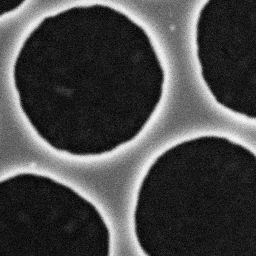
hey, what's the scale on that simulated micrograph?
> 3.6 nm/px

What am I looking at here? holes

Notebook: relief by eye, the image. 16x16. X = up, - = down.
-XXX---XXXXXX---
XX-------XXX----
XX-------XXX----
X---------XX----
X---------XXX---
X---------XXX---
X---------XXXX--
XX-------XXXXXXX
XX-------XXXXXXX
XXXX---XXX------
XXXXXXXXX-------
----XXXXX-------
-----XXXX-------
------XX--------
-------X--------
-------XX-------